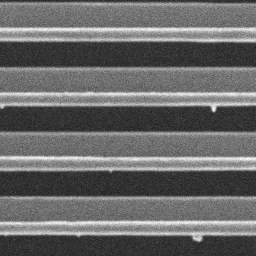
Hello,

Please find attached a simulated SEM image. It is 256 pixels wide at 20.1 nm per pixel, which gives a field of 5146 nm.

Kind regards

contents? lines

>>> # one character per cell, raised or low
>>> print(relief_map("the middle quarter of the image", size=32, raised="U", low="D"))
DDDDDDDDDDDDDDDDDDDDDDDDDDDDDDDD
UUUUUUUUUUUUUUUUUUUUUUUUUUUUUUUU
UUUUUUUUUUUUUUUUUUUUUUUUUUUUUUUU
UUUUUUUUUUUUUUUUUUUUUUUUUUUUUUUU
UUUUUUUUUUUUUUUUUUUUUUUUUUUUUUUU
UUUUUUUUUUUUUUUUUUUUUUUUUUUUUUUU
UUUUUUUUUUUUUUUUUUUUUUUUUUUUUUUU
UUUUUUUUUUUUUUUUUUUUUUUUUUUUUUUU
UUUUUUUUUUUUUUUUUUUUUUUUUUUUUUUU
UUUUUUUUUUUUUUUUUUUUUUUUUUUUUUUU
DDDDDDDDDDDDDDDDDDDDDDDDDDDDDDDD
DDDDDDDDDDDDDDDDDDDDDDDDDDDDDDDD
DDDDDDDDDDDDDDDDDDDDDDDDDDDDDDDD
DDDDDDDDDDDDDDDDDDDDDDDDDDDDDDDD
DDDDDDDDDDDDDDDDDDDDDDDDDDDDDDDD
DDDDDDDDDDDDDDDDDDDDDDDDDDDDDDDD
DDDDDDDDDDDDDDDDDDDDDDDDDDDDDDDD
UUUUUUUUUUUUUUUUUUUUUUUUUUUUUUUU
UUUUUUUUUUUUUUUUUUUUUUUUUUUUUUUU
UUUUUUUUUUUUUUUUUUUUUUUUUUUUUUUU
UUUUUUUUUUUUUUUUUUUUUUUUUUUUUUUU
UUUUUUUUUUUUUUUUUUUUUUUUUUUUUUUU
UUUUUUUUUUUUUUUUUUUUUUUUUUUUUUUU
UUUUUUUUUUUUUUUUUUUUUUUUUUUUUUUU
UUUUUUUUUUUUUUUUUUUUUUUUUUUUUUUU
UUUUUUUUUUUUUUUUUUUUUUUUUUUUUUUU
DDDDDDDDDDDUDDDDDDDDDDDDDDDDDDDD
DDDDDDDDDDDDDDDDDDDDDDDDDDDDDDDD
DDDDDDDDDDDDDDDDDDDDDDDDDDDDDDDD
DDDDDDDDDDDDDDDDDDDDDDDDDDDDDDDD
DDDDDDDDDDDDDDDDDDDDDDDDDDDDDDDD
DDDDDDDDDDDDDDDDDDDDDDDDDDDDDDDD